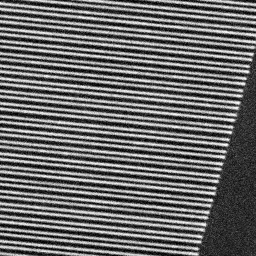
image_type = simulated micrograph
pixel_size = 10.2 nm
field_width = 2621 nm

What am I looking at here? parallel lines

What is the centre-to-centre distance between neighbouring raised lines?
63.5 nanometers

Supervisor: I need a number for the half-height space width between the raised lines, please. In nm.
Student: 43.2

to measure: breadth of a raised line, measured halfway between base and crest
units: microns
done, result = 0.0178